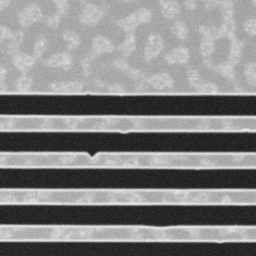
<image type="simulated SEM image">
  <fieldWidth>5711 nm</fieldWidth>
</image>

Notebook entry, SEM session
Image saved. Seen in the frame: parallel lines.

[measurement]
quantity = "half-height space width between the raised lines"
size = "494 nanometres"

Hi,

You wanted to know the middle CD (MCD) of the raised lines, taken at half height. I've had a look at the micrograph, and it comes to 315 nm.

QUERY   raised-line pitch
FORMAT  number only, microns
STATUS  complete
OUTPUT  0.817